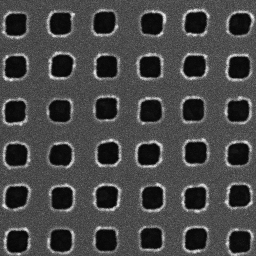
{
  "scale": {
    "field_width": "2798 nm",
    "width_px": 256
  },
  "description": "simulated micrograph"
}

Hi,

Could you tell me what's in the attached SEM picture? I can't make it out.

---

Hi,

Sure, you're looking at a regular array of holes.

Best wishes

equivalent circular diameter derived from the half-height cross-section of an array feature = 258 nanometres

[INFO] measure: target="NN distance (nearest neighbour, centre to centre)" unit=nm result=465